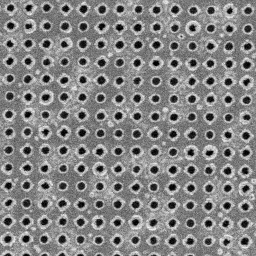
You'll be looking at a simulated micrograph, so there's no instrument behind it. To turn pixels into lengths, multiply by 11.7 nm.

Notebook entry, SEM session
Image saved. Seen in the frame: a regular array of holes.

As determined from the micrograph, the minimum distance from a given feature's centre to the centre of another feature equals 203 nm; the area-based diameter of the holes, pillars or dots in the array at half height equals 0.0985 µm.